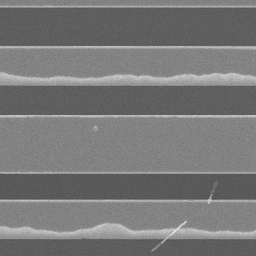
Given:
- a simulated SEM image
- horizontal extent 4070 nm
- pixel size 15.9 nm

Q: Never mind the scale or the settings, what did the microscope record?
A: lines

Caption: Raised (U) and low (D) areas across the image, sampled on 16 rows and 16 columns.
DDDDDDDDDDDDDDDD
DDDDDDDDDDDDDDDD
DDDDDDDDDDDDDDDD
UUUUUUUUUUUUUUUU
UUUUUUUUUUUUUUUU
DDDDDDDDDDDDDDDD
DDDDDDDDDDDDDDDD
UUUUUUUUUUUUUUUU
UUUUUUUUUUUUUUUU
UUUUUUUUUUUUUUUU
UUUUUUUUUUUUUUUU
DDDDDDDDDDDDDDDD
DDDDDDDDDDDDDUDD
UUUUUUUUUUUUUUUU
UUUUUUUUUUUUUUUU
DDDDDDDDDDDDDDDD